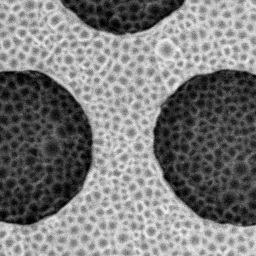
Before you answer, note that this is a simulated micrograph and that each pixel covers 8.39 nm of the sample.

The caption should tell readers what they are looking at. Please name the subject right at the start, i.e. holes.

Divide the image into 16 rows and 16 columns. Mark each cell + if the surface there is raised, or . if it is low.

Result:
++++.......+++++
+++++.....++++++
++++++++++++++++
++++++++++++++++
...++++++++++..+
....+++++++.....
.....+++++......
......++++......
......++++......
......++++......
......++++......
.....++++++.....
....+++++++.....
...+++++++++....
++++++++++++++++
++++++++++++++++